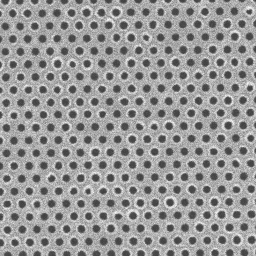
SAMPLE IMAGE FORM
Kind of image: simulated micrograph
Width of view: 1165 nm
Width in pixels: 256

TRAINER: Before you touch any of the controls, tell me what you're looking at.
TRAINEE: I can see a regular array of holes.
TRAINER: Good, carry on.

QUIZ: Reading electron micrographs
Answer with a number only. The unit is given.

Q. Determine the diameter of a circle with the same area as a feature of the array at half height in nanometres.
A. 32.9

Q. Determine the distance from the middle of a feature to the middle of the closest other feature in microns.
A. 0.0652